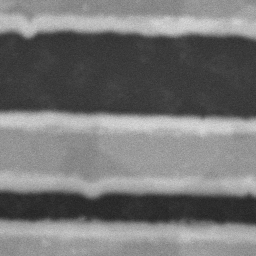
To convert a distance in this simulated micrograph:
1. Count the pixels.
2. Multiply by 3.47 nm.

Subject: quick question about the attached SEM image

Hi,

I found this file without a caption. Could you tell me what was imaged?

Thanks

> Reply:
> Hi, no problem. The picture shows one or a few lines or trenches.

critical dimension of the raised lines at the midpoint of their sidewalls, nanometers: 215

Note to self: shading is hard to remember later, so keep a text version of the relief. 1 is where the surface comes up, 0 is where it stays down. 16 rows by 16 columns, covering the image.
1111111111111111
0110001111111111
0000000000000000
0000000000000000
0000000000000000
0000000000000000
0000000000000000
0010000000000000
1111111111111111
1111111111111111
1111111111111111
0010011111111111
0000000000000000
0000000000000000
1111111111110010
1111111111111111